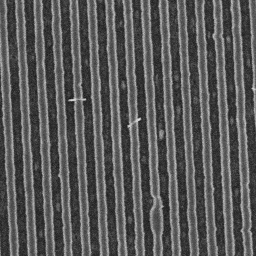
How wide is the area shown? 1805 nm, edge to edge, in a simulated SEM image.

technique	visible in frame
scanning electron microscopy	parallel lines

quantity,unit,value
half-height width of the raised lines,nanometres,53.7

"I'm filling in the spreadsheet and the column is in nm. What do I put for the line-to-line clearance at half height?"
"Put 73.9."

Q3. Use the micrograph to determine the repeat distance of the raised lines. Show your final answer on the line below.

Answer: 127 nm